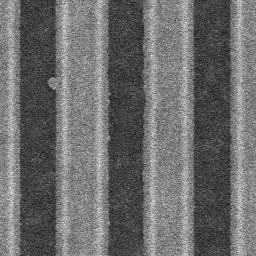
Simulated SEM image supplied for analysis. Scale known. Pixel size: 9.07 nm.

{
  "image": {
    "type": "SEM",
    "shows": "one or a few lines or trenches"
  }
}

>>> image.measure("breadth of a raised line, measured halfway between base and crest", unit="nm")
302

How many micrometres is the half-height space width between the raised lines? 0.487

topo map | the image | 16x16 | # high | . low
#...##....##...#
#...##....##...#
#...##....##...#
#...##....##...#
#...##....##...#
#...##....##...#
#...##....##...#
#...##....##...#
#...##....##...#
#...##....##...#
#...##....##...#
#...##....##...#
#...##....##...#
#...##....##...#
#...##....##...#
#...##....##...#